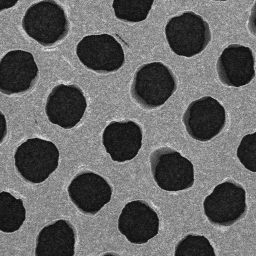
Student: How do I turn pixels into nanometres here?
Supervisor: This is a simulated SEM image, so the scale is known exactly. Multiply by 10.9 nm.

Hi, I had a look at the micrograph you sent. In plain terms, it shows a regular array of holes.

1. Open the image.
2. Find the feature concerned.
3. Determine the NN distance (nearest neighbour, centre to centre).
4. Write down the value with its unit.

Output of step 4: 650 nm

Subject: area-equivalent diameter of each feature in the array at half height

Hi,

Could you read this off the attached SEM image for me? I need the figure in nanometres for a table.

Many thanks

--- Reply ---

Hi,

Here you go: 455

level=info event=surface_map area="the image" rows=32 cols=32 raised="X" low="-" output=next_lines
--XX---XXXXXXX-----XXXXXXXXXXXXX
XXX-----XXXXXX-----XXXXXXXXXXXXX
XXX-----XXXXXXXX--XXX----XXXXXX-
XXX-----XXXXXXXXXXXXX-----XXXXXX
XXXX----XXX---XXXXXXX-----XXXXXX
XXXXX-XXXX-----XXXXXX-----XXXXXX
X--XXXXXXX-----XXXXXXX---XXX---X
----XXXXXX-----XXXXXXXXXXXX-----
-----XXXXXX----XXX---XXXXXX-----
----XXXXXXXXXXXXX-----XXXXXX----
----XXXXXXXXXXXXX-----XXXXXX---X
---XXX----XXXXXXX-----XXXXXXXXXX
XXXXXX-----XXXXXX----XXXX--XXXXX
XXXXXX-----XXXXXXXXXXXX-----XXXX
XXXXXX----XXXXXXXXXXXXX-----XXXX
-XXXXXX---XXXX---XXXXXX-----XXXX
-XXXXXXXXXXXX-----XXXXXX---XXXXX
XXXX-XXXXXXXX-----XXXXXXX-XXXX--
XX-----XXXXXX-----XXXXXXXXXXXX--
XX-----XXXXXXX---XX----XXXXXXX--
XX-----XXXXXXXXXXXX-----XXXXXX--
XX-----XXXXXXXXXXXX-----XXXXXXXX
XXX---XXX----XXXXXX-----XXXXXXXX
XXXXXXXXX-----XXXXXX---XXXX---XX
--XXXXXXX-----XXXXXXXXXXXX-----X
---XXXXXX----XXX--XXXXXXX------X
---XXXXXXXX-XXX----XXXXXXX----XX
---XXXXXXXXXXXX-----XXXXXX---XXX
--XXXX---XXXXXX-----XXXXXXXXXXXX
XXXXX----XXXXXXX---XXXXXXXXXXXXX
XXXXX----XXXXXXXXXXXXX----XXXXXX
XXXX-----XXXXXXXXXXXXX-----XXXXX